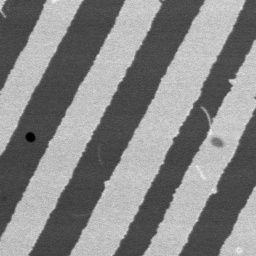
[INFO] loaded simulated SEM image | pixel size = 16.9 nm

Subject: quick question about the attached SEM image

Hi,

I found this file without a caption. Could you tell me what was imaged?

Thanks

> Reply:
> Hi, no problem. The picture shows one or a few lines or trenches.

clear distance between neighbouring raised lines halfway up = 623 nanometers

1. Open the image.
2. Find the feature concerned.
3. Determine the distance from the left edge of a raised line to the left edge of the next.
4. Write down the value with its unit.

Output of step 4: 1.15 micrometres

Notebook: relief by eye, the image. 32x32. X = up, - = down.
------XXXX-----XXXXX-----XXXXX--
-----XXXX------XXXXX-----XXXXX--
-----XXXX------XXXX-----XXXXX---
----XXXX------XXXXX-----XXXXX---
----XXXX------XXXX-----XXXXX----
---XXXX------XXXXX-----XXXXX----
---XXXX-----XXXXX-----XXXXX----X
--XXXX------XXXXX-----XXXXX----X
--XXXX-----XXXXX-----XXXXX----XX
-XXXX------XXXX------XXXXX----XX
-XXXX-----XXXXX-----XXXXX----XXX
XXXX------XXXX------XXXXX----XXX
XXXX-----XXXXX-----XXXXX----XXXX
XXX------XXXX------XXXXX----XXXX
XXX-----XXXXX-----XXXXX----XXXX-
XX------XXXX-----XXXXXX----XXXX-
XX-----XXXXX-----XXXXX----XXXX--
X-----XXXXX-----XXXXXX----XXXX--
X-----XXXXX-----XXXXX----XXXX---
-----XXXXX-----XXXXXX---XXXXX---
-----XXXXX-----XXXXX----XXXX----
----XXXXX-----XXXXXX---XXXXX----
----XXXXX-----XXXXX----XXXX-----
---XXXXX-----XXXXXX---XXXXX-----
---XXXX------XXXXX----XXXX-----X
--XXXXX-----XXXXXX---XXXXX-----X
--XXXX------XXXXX----XXXX-----XX
-XXXXX-----XXXXX----XXXXX-----XX
-XXXX------XXXXX----XXXX-----XXX
XXXXX-----XXXXX----XXXX------XXX
XXXX------XXXXX----XXXX-----XXXX
XXXX-----XXXXX----XXXX------XXXX